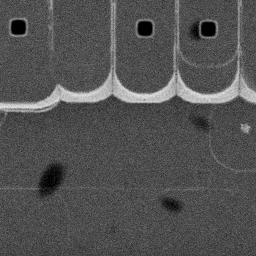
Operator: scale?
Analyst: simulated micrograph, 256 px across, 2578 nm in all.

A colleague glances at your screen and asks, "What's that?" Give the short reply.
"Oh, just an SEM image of wiring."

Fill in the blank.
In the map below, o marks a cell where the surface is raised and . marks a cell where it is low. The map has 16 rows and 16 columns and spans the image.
oooooooooooooooo
oooooooooooooooo
oooooooooooooooo
oooooooooooooooo
oooooooooooooooo
oooooooooooooooo
ooo.............
................
................
................
................
................
................
................
................
................